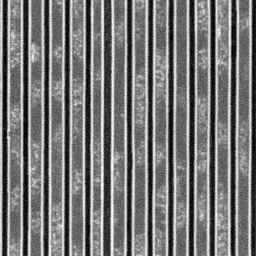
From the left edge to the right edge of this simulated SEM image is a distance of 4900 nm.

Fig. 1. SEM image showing parallel lines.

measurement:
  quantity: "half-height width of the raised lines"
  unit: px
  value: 13.9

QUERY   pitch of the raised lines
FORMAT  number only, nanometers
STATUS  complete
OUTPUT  398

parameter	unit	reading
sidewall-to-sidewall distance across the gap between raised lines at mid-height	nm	141